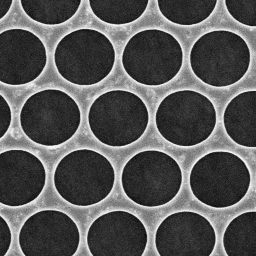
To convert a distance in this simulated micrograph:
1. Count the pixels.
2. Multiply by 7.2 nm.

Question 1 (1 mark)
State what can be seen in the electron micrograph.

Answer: a regular array of holes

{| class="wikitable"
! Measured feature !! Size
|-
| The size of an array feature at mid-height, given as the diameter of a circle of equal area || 422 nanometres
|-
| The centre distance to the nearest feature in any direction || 487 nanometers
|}